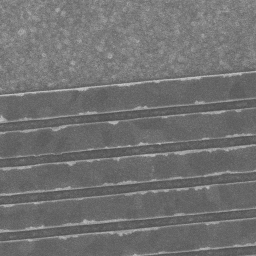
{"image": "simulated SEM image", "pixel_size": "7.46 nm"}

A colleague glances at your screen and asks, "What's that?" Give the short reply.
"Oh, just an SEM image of parallel lines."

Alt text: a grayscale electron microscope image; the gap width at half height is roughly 74.3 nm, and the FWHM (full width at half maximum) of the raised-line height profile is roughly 203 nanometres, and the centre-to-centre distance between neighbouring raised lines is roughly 272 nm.